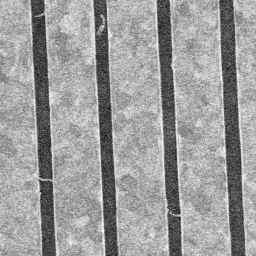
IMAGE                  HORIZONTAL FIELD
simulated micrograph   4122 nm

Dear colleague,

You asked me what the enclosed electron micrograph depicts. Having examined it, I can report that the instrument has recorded parallel lines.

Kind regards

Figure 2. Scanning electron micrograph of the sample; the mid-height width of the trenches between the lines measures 238 nm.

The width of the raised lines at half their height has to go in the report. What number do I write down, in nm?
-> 770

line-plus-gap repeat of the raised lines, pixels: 62.8